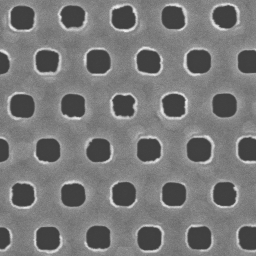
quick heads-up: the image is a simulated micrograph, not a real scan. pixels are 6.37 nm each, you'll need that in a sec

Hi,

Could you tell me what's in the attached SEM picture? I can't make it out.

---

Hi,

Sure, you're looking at a regular array of holes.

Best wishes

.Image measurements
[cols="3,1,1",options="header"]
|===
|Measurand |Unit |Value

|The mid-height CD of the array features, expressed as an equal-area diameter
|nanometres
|158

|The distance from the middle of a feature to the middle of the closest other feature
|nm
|319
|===